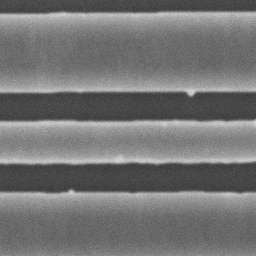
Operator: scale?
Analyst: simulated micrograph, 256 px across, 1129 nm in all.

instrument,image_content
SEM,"lines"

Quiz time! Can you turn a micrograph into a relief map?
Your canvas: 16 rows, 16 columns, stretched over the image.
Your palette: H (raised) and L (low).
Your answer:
LLLLLLLLLLLLLLLL
HHHHHHHHHHHHHHHH
HHHHHHHHHHHHHHHH
HHHHHHHHHHHHHHHH
HHHHHHHHHHHHHHHH
HHHHHHHHHHHHHHHH
LLLLLLLLLLLLLLLL
LLLLLLLLLLLLLLLL
HHHHHHHHHHHHHHHH
HHHHHHHHHHHHHHHH
LLLLLLLLLLLLLLLL
LLLLLLLLLLLLLLLL
HHHHHHHHHHHHHHHH
HHHHHHHHHHHHHHHH
HHHHHHHHHHHHHHHH
HHHHHHHHHHHHHHHH